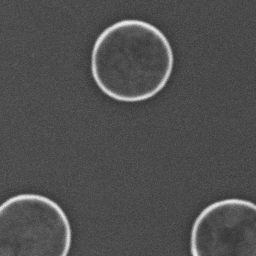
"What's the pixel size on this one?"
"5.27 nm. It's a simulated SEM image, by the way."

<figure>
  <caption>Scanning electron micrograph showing raised bodies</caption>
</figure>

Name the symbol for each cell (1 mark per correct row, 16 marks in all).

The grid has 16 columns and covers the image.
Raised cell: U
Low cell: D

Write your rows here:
DDDDDDDDDDDDDDDD
DDDDDDDDUDDDDDDD
DDDDDDUUUUDDDDDD
DDDDDDUUUUUDDDDD
DDDDDDUUUUUDDDDD
DDDDDDUUUUDDDDDD
DDDDDDDDDDDDDDDD
DDDDDDDDDDDDDDDD
DDDDDDDDDDDDDDDD
DDDDDDDDDDDDDDDD
DDDDDDDDDDDDDDDD
DDDDDDDDDDDDDDDD
DUUDDDDDDDDDDDDD
UUUUDDDDDDDDDUUU
UUUUDDDDDDDDUUUU
UUUUDDDDDDDDUUUU